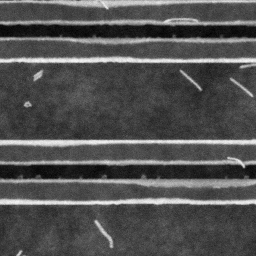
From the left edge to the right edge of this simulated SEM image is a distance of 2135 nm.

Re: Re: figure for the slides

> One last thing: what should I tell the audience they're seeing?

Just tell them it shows lines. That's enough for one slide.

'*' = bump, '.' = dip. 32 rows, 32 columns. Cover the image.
********************************
********************************
********************************
................................
................................
********************************
********************************
********************************
................................
................................
................................
................................
................................
................................
................................
................................
................................
................................
********************************
********************************
.***................*.........**
................................
**.**....*......................
********************************
********************************
................................
................................
................................
................................
................................
................................
................................